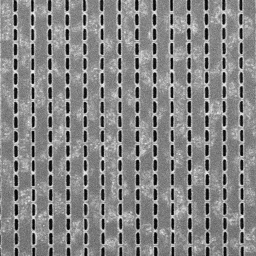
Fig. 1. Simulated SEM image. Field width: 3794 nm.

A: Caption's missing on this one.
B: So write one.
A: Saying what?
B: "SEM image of a regular array of holes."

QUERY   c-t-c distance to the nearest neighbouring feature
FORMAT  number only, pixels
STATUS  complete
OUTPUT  14.3